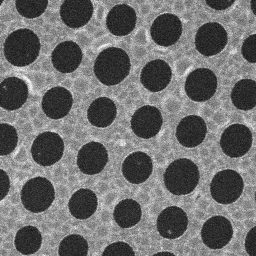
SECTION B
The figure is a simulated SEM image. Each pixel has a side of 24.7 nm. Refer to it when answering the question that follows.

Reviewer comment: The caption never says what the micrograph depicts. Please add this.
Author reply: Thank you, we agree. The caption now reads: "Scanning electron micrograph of a regular array of holes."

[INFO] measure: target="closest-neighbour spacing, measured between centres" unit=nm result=1130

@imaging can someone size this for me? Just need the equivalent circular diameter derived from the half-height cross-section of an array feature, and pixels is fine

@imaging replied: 33.5